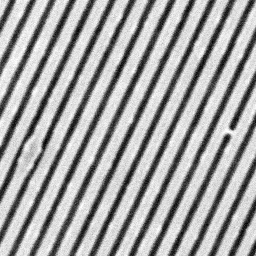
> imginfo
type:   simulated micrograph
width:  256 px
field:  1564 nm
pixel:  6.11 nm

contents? parallel lines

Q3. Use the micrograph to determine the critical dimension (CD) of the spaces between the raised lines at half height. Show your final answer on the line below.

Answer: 51.1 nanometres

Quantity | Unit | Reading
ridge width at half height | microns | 0.0629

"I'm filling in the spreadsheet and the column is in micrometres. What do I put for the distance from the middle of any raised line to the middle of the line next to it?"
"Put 0.11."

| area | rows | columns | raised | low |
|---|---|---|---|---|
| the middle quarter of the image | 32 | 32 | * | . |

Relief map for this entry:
.**..***...**..***..***...**...*
***..***..***..***..***..***..**
**...**..***...**...**...**...**
**..***..***..***..***..***..***
*...**...**...**...**...**...**.
*..***..***..***..***..***..***.
...**...**...**...**...**...**..
..***..***..***..***..***..***..
..**...**...**...***..**...**...
.***..***..***..***..***..***..*
.**...**...**...**...**...***..*
***..***..***..***..***..***..**
**...**...**...***..**...**...**
**...**..***..***..***..***..***
**..***..**...***..**...***..***
*...**..***..***...**..***..***.
*..***..**...***..***..**...***.
...**...**..***...**...**..***..
..***..***..***..***..***..***..
..**...**..***...**...**..***...
.***..***..***..***..***..***..*
.**...**...**...**...**...**...*
***..***..***..***..***..***..**
**...**...**...**...**...**...**
**..***..***..***..***..***..***
*...**...***..**...**...**...**.
*..***..***..***..***..***..***.
...**...**...**...**...**...**..
..***..***..***..***..***..***..
..**...***..**...**...**...**...
.***..***..***..***..***..***..*
.**...***..**...**...***..**...*